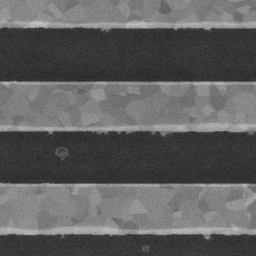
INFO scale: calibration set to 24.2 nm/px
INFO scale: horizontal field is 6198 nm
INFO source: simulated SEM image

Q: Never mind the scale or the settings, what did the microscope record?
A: lines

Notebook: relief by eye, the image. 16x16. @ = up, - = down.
@@@@@@@@@@@@@@@@
@@@@@@@@@@@@@@@@
----------------
----------------
----------------
@@@@@@@@@@@@@@@@
@@@@@@@@@@@@@@@@
@@@@@@@@@@@@@@@@
----------------
----------------
----------------
----------------
@@@@@@@@@@@@@@@@
@@@@@@@@@@@@@@@@
@@@@--@@@@@@@@@@
----------------